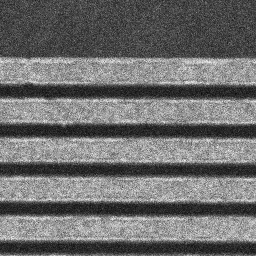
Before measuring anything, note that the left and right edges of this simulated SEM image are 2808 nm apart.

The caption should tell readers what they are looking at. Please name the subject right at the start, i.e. parallel lines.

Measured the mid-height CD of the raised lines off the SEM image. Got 276 nanometres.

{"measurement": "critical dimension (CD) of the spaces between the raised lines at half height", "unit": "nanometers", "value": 148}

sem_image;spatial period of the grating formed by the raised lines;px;39.1